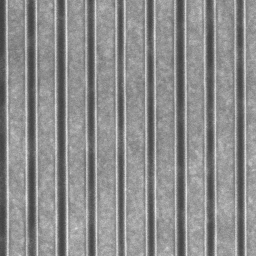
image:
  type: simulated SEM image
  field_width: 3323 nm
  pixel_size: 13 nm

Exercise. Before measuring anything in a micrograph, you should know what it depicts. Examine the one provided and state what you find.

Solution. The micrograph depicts parallel lines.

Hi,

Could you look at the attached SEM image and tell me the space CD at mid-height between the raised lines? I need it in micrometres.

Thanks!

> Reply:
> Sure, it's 0.245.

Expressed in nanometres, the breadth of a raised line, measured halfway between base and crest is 140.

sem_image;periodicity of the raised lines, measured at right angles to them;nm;388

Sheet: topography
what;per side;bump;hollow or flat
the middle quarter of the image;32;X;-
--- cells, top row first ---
X-----XX-----XX-----XXX-----XX--
X-----XX-----XX-----XXX-----XX--
X-----XX-----XX-----XXX-----XX--
X-----XX-----XX-----XXX-----XX--
X-----XX-----XX-----XXX-----XX--
X-----XX-----XX-----XXX-----XX--
X-----XX-----XX-----XXX-----XXX-
X-----XX-----XX-----XXX-----XXX-
X-----XX-----XX-----XXX-----XXX-
X-----XX-----XX-----XXX-----XXX-
X-----XX-----XX-----XXX-----XXX-
X-----XX-----XX-----XXX-----XXX-
X-----XX-----XX-----XXX-----XXX-
X-----XX-----XX-----XXX-----XXX-
X-----XX-----XX-----XXX-----XXX-
X-----XX-----XX-----XXX-----XXX-
X-----XX-----XX-----XXX-----XXX-
X-----XX-----XX-----XXX-----XXX-
X-----XX-----XX-----XXX-----XXX-
X-----XX-----XX-----XXX-----XXX-
X-----XX-----XX-----XXX-----XXX-
X-----XX-----XX-----XXX-----XXX-
X-----XX-----XX-----XXX-----XXX-
X-----XX-----XX-----XXX-----XXX-
X-----XX-----XX-----XXX-----XXX-
X-----XX-----XX-----XXX-----XXX-
X-----XX-----XX---X--XX-----XXX-
X-----XX-----XX---X--XX-----XXX-
X-----XX-----XX------XX-----XXX-
X-----XX-----XX------XX-----XXX-
X-----XX-----XX------XX-----XXX-
X-----XX-----XX------XX-----XXX-